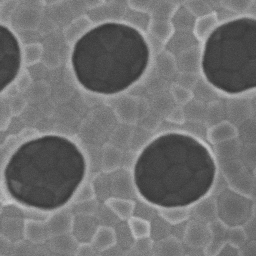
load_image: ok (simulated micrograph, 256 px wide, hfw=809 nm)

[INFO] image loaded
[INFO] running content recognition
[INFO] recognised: holes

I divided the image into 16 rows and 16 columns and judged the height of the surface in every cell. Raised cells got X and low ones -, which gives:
XXXXXXXXXXXXXXXX
XXXXXXXXXXXXXX--
-XXXX----XXXX---
-XXXX----XXXX---
-XXXX----XXXX---
XXXXX---XXXXXX--
XXXXXXXXXXXXXXXX
XXXXXXXXXXXXXXXX
XXX-XXXXXX--XXXX
X----XXXX----XXX
-----XXX-----XXX
-----XXXX----XXX
X---XXXXX---XXXX
XXXXXXXXXXXXXXXX
XXXXXXXXXXXXXXXX
XXXXXXXXXXXXXXXX